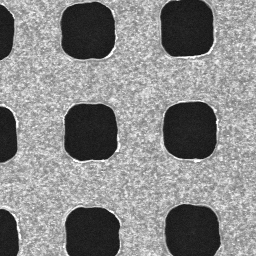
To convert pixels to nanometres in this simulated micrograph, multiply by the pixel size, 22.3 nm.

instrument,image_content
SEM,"holes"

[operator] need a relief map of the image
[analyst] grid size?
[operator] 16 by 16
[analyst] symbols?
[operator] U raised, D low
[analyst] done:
UUUUDDDUUUDDDUUU
DUUUDDDUUUDDDUUU
DUUUDDDUUUDDDUUU
UUUUDDDUUUUDUUUU
UUUUUUUUUUUUUUUU
UUUUUUUUUUUUUUUU
UUUUUUUUUUUDDUUU
DUUUDDDUUUDDDDUU
DUUUDDDUUUDDDDUU
DUUUDDDUUUUDDUUU
UUUUUUUUUUUUUUUU
UUUUUUUUUUUUUUUU
UUUUUUUUUUUUUUUU
DUUUDDDUUUDDDUUU
DUUUDDDUUUDDDDUU
DUUUDDDUUUDDDDUU